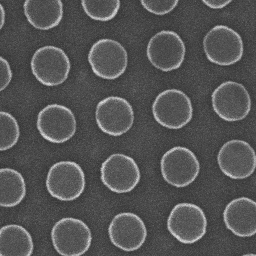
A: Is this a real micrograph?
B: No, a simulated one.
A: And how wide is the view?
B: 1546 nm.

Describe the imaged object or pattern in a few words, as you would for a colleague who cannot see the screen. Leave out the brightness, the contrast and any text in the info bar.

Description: a regular array of raised bodies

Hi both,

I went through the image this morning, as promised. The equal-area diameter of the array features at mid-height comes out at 233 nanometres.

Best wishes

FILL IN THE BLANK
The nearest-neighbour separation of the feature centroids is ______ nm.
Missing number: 346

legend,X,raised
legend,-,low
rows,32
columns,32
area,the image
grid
---XXXXX--XXXXX---XXXX----XX----
---XXXXX---XXXX----XX-----------
----XXX-------------------------
-----X---------------------XX---
-------------------XXX----XXXX--
------------XXX----XXXX--XXXXX--
-----XXX---XXXXX--XXXXX---XXXX--
X---XXXXX--XXXXX---XXXX---XXXX--
X---XXXXX---XXXX----XX----------
X---XXXX----XXX-----------------
X-----X---------------------XX--
--------------------XXX----XXXX-
-------------XX----XXXXX---XXXX-
------XX----XXXX---XXXXX---XXXX-
X----XXXX---XXXXX--XXXXX----XXX-
XX---XXXX---XXXX----XXX---------
XX---XXXX----XXX----------------
XX----XX------------------------
X---------------------X-----XXX-
--------------XX-----XXX---XXXXX
-------XXX---XXXX---XXXXX--XXXXX
XX----XXXX---XXXX---XXXXX---XXX-
XXX---XXXXX--XXXX----XXX--------
XXX---XXXX----XX----------------
XXX----XXX----------------------
XX---------------------X-----XXX
---------------------XXXX---XXXX
--------XX----XXX----XXXXX--XXXX
XXX----XXXX---XXXX---XXXXX---XXX
XXXX--XXXXX---XXXX----XXX-----X-
XXXX---XXXX---XXXX--------------
XXXX---XXX----------------------